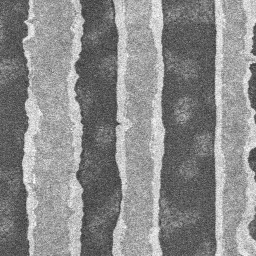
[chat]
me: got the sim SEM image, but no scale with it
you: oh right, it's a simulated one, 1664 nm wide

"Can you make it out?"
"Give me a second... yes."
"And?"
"one or a few lines or trenches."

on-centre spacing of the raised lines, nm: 588